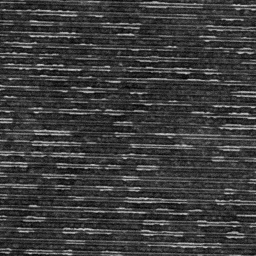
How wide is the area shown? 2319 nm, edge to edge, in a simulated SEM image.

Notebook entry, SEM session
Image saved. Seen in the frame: parallel lines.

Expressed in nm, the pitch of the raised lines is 98.5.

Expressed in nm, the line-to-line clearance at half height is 63.4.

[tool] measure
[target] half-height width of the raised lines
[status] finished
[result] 0.0351 µm